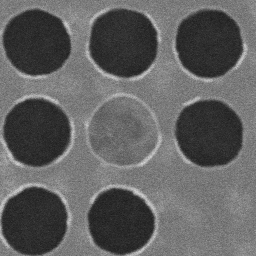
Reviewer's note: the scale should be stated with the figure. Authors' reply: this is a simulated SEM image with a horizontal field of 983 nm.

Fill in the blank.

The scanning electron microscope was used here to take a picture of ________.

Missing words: holes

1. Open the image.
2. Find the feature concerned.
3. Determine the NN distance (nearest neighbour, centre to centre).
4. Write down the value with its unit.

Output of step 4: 0.339 um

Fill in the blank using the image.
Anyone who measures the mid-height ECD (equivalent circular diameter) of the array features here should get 260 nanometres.